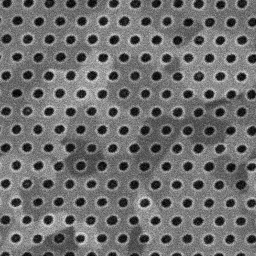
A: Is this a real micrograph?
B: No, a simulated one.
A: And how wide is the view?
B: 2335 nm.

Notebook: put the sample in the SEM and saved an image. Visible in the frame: a regular array of holes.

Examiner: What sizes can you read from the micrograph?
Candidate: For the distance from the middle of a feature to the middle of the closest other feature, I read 0.189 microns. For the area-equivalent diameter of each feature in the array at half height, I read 95.5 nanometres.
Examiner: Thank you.